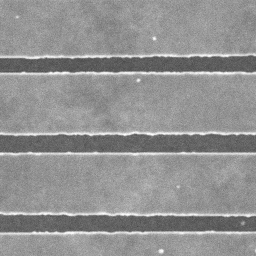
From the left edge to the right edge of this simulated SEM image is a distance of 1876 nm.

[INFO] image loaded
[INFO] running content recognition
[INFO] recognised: lines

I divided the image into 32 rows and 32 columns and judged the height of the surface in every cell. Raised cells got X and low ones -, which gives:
XXXXXXXXXXXXXXXXXXXXXXXXXXXXXXXX
XXXXXXXXXXXXXXXXXXXXXXXXXXXXXXXX
XXXXXXXXXXXXXXXXXXXXXXXXXXXXXXXX
XXXXXXXXXXXXXXXXXXXXXXXXXXXXXXXX
XXXXXXXXXXXXXXXXXXXXXXXXXXXXXXXX
XXXXXXXXXXXXXXXXXXXXXXXXXXXXXXXX
XXXXXXXXXXXXXXXXXXXXXXXXXXXXXXXX
--------------------------------
--------------------------------
XXXXXXXXXXXXXXXXXXXXXXXXXXXXXXXX
XXXXXXXXXXXXXXXXXXXXXXXXXXXXXXXX
XXXXXXXXXXXXXXXXXXXXXXXXXXXXXXXX
XXXXXXXXXXXXXXXXXXXXXXXXXXXXXXXX
XXXXXXXXXXXXXXXXXXXXXXXXXXXXXXXX
XXXXXXXXXXXXXXXXXXXXXXXXXXXXXXXX
XXXXXXXXXXXXXXXXXXXXXXXXXXXXXXXX
XXXXXXXXXXXXXXXXXXXXXXXXXXXXXXXX
--------------------------------
--------------------------------
XXXXXXXXXXXXXXXXXXXXXXXXXXXXXXXX
XXXXXXXXXXXXXXXXXXXXXXXXXXXXXXXX
XXXXXXXXXXXXXXXXXXXXXXXXXXXXXXXX
XXXXXXXXXXXXXXXXXXXXXXXXXXXXXXXX
XXXXXXXXXXXXXXXXXXXXXXXXXXXXXXXX
XXXXXXXXXXXXXXXXXXXXXXXXXXXXXXXX
XXXXXXXXXXXXXXXXXXXXXXXXXXXXXXXX
XXXXXXXXXXXXXXXXXXXXXXXXXXXXXXXX
--------------------------------
--------------------------------
XXXXXXXXXXXXXXXXXXXXXXXXXXXXXXXX
XXXXXXXXXXXXXXXXXXXXXXXXXXXXXXXX
XXXXXXXXXXXXXXXXXXXXXXXXXXXXXXXX